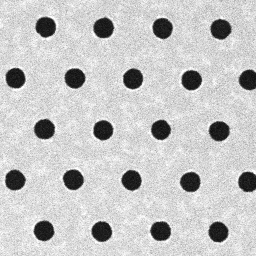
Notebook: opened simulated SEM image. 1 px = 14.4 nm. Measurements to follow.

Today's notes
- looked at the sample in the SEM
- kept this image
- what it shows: a regular array of holes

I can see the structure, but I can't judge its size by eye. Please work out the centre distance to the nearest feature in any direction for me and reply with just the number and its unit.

0.836 microns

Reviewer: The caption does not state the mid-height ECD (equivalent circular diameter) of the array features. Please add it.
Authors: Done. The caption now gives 302 nm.